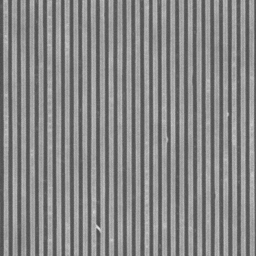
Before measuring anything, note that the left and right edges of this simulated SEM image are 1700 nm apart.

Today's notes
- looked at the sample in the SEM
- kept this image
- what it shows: parallel lines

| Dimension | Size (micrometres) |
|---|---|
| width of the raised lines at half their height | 0.0307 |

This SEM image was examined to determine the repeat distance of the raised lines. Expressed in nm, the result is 58.3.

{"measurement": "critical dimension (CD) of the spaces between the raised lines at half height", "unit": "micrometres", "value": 0.0307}